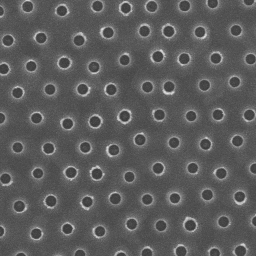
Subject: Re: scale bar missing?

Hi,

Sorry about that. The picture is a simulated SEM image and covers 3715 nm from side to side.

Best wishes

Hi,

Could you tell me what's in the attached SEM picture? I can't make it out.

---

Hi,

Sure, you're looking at a regular array of holes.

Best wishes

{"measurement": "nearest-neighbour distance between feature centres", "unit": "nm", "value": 409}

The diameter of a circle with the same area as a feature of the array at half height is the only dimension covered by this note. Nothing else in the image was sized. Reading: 160 nm